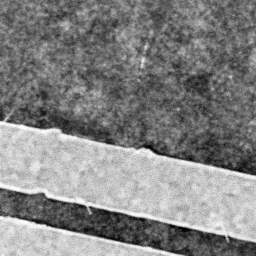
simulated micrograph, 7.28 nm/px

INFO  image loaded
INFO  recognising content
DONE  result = one or a few lines or trenches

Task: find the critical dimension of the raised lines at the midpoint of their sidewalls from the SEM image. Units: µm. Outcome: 0.451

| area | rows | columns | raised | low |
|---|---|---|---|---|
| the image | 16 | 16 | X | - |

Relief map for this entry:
----------------
----------------
----------------
----------------
----------------
----------------
----------------
----------------
XXXX------------
XXXXXXXXX-------
XXXXXXXXXXXXX---
XXXXXXXXXXXXXXXX
----XXXXXXXXXXXX
---------XXXXXXX
XXXX---------XXX
XXXXXXXXX-------